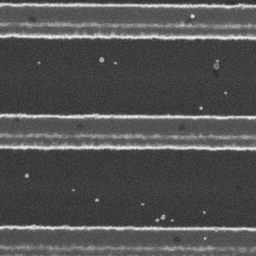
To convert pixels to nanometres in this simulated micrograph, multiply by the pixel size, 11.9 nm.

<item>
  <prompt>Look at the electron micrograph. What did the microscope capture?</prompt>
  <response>lines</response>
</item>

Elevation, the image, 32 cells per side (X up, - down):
--------------------------------
XXXXXXXXXXXXXXXXXXXXXXXXXXXXXXXX
XXXXXXXXXXXXXXXXXXXXXXXXXXXXXXXX
XXXXXXXXXXXXXXXXXXXXXXXXXXXXXXXX
------X-X--XXXXXXXXXXXXXXXXXXXXX
--------------------------------
--------------------------------
--------------------------------
--------------------------------
--------------------------------
--------------------------------
--------------------------------
--------------------------------
--------------------------------
XXX--------XX-------------------
XXXXXXXXXXXXXXXXXXXXXXXXXXXXXXXX
XXXXXXXXXXXXXXXXXXXXXXXXXXXXXXXX
XXXXXXXXXXXXXXXXXXXXXXXXXXXXXXXX
--------------------------XX-XXX
--------------------------------
--------------------------------
--------------------------------
--------------------------------
--------------------------------
--------------------------------
--------------------------------
--------------------------------
--------------------------------
XXXXX---XXXX----X----------X----
XXXXXXXXXXXXXXXXXXXXXXXXXXXXXXXX
XXXXXXXXXXXXXXXXXXXXXXXXXXXXXXXX
XXXXXXXXXXXXXXXXXXXXXXXXXXXXXXXX